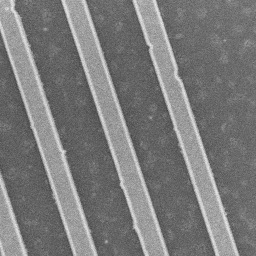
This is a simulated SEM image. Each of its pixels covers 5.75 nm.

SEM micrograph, one or a few lines or trenches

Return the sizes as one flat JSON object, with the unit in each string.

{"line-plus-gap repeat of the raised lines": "388 nm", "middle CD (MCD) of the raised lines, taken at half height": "109 nm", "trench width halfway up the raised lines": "0.279 microns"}